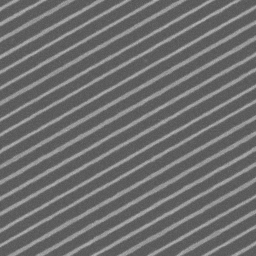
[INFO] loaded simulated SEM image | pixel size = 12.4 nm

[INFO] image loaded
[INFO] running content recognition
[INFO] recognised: parallel lines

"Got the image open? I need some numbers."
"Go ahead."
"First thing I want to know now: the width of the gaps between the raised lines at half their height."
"128 nanometres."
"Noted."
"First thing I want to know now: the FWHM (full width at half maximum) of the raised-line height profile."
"0.0325 um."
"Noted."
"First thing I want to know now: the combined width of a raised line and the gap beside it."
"171 nm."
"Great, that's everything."